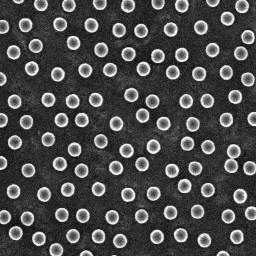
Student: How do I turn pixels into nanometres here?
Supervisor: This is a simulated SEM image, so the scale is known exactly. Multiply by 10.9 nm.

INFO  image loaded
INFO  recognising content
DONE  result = a regular array of raised bodies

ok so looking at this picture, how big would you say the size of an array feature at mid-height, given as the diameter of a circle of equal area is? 141 nm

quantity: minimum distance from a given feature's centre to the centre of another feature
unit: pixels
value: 22.3